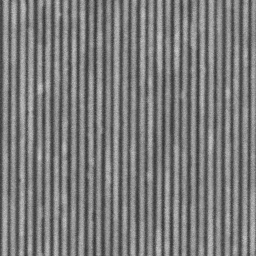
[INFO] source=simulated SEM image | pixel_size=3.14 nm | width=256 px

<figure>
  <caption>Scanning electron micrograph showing parallel lines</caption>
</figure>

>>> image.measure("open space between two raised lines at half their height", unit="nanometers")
11.8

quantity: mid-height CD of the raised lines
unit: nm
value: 14.9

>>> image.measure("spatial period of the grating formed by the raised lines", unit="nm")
26.8